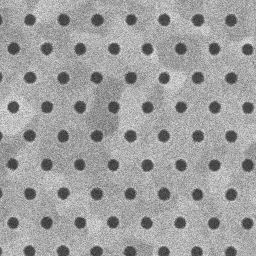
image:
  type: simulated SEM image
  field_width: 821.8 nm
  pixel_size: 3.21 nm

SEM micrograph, a regular array of holes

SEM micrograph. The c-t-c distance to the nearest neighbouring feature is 106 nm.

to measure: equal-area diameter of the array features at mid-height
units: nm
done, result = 41.3